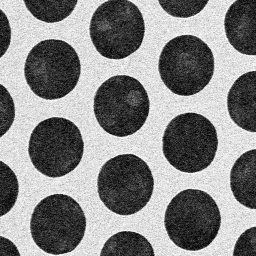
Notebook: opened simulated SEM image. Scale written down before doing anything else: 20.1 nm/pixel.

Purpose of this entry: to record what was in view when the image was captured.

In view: a regular array of holes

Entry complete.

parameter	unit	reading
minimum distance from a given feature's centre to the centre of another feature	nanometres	1540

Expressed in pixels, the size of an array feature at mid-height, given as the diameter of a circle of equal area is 58.8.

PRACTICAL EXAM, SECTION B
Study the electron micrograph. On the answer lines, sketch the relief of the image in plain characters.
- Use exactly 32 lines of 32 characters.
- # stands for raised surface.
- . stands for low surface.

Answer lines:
###.......###....###......###...
####.....###......###....###....
.####...###.......##########....
.##########.......##########....
.##########.......####..####....
.####....###......###.....###...
.###......##.....###......####..
###.......##########.......#####
###.......##########.......#####
###.......####..####.......###..
###.......###.....###.....###...
.###.....###......####...####...
..##########.......#########....
..##########.......#########....
..##########......####...####...
..###....###......###......##...
.###......###....####......####.
####......##########.......#####
####......##########.......#####
####......#####..####......###..
.###......###.....###.....###...
..###....###.......####..####...
..##########.......##########...
..##########.......##########...
..####...###.......###....###...
..###.....###.....###......###..
.###......####...####......#####
####.......##########.......####
####.......##########......####.
####......####....###......###..
..##......###......###....###...
..####...####......##########...